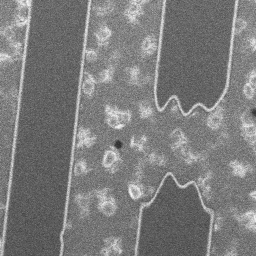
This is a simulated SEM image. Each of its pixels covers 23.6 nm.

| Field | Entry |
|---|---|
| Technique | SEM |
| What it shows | one or a few lines or trenches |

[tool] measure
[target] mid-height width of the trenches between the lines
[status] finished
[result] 1770 nm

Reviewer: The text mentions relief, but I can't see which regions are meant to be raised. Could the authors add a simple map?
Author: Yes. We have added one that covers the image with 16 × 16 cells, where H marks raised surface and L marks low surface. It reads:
LLHHHHLLLLHHHHHL
LLHHHLLLLLHHHHHL
LLHHHLLLLLHHHHHL
LLHHHLLLLLHHHHLL
LHHHHLLLLLHHHHLL
LHHHHLLLLLHHHHLL
LHHHHLLLLLLHHHLL
LHHHHLLLLLLLLLLL
LHHHHLLLLLLLLLLL
LHHHHLLLLLLLLLLL
LHHHLLLLLLLLLLLL
LHHHLLLLLLHLLLLL
HHHHLLLLLHHHHLLL
HHHHLLLLLHHHHLLL
HHHHLLLLLHHHHLLL
HHHHLLLLLHHHHLLL